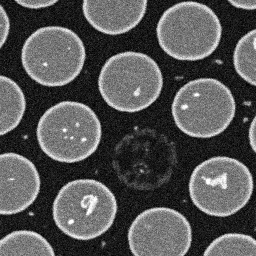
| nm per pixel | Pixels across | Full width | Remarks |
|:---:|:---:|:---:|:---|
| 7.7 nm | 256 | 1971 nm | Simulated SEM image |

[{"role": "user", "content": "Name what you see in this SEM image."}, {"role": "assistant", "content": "raised bodies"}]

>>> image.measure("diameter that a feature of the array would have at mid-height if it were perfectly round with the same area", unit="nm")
462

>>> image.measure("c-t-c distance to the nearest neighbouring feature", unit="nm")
597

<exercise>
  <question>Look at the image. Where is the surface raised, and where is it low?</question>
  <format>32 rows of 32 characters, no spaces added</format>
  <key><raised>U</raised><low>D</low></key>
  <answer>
DDDUUUDDDDDUUUUUUUDDDDDUUDDDDUUU
DDDDDDDDDDDUUUUUUUDDDUUUUUDDDDDD
UDDDDDDDDDDUUUUUUDDDUUUUUUUDDDDD
UDDDDDUUDDDDUUUUDDDDUUUUUUUDDDDD
UDDDUUUUUUDDDDDDDDDDUUUUUUUDDDDU
DDDUUUUUUUDDDDDDDDDDUUUUUUUDDDUU
DDDUUUUUUUDDDDDDDDDDDUUUUUDDDUUU
DDDUUUUUUUDDDDUUUUUDDDDDDDDDDUUU
DDDUUUUUUUDDDUUUUUUUDDDDDDDDDUUU
DDDDUUUUUDDDDUUUUUUUDDDDDDDDDDUU
UUDDDUUUDDDDUUUUUUUUDDDUUUUUDDDD
UUUDDDDDDDDDDUUUUUUUDDUUUUUUUDDD
UUUDDDDDDDDDDUUUUUUDDDUUUUUUUDDD
UUUDDDDUUUUDDDDUUUDDDDUUUUUUUDDD
UUUDDUUUUUUUDDDDDDDDDDUUUUUUUDDD
UUDDDUUUUUUUDDDDDDDDDDUUUUUUDDDD
UDDDDUUUUUUUDDDDDDDDDDDUUUUDDDDU
DDDDDUUUUUUUDDDDDDDDDDDDDDDDDDDU
DDDDDUUUUUUUDDDDDDDDDDDDDDDDDDDD
UUDDDDUUUUUDDDDDDDDDDDDDDDDDDDDD
UUUUDDDDDDDDDDDDDDDDDDDDDUUUUUDD
UUUUUDDDDDDDDDDDDDDDDDDDUUUUUUUD
UUUUUDDDDDDDDDDDDDDDDDDDUUUUUUUD
UUUUUDDDUUUUUDDDDDDDDDDDUUUUUUUD
UUUUDDDUUUUUUUDDDDDDDDDDUUUUUUUD
UUUUDDDUUUUUUUDDDDDDDDDDUUUUUUUD
UUDDDDDUUUUUUUDDDDUUUUDDDDUUUDDD
DDDDDDDUUUUUUUDDDUUUUUUDDDDDDDDD
DDDDDDDDUUUUUDDDUUUUUUUUDDDDDDDD
DUUUUDDDDUUUDDDDUUUUUUUUDDDDUUUD
UUUUUUDDDDDDDDDDUUUUUUUUDDDUUUUU
UUUUUUUDDDDDDDDDDUUUUUUDDDUUUUUU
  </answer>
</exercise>